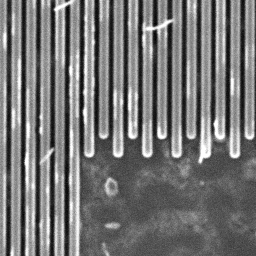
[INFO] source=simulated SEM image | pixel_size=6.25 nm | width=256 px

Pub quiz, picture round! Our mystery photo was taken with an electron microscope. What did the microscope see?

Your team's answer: parallel lines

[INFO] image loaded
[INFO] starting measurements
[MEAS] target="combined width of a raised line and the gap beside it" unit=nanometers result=91.1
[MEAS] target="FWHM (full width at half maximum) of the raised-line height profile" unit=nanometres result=55.4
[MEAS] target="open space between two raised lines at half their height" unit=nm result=36.7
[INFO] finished